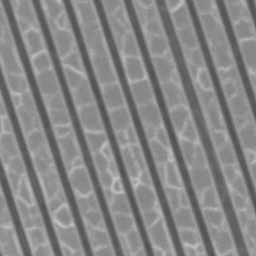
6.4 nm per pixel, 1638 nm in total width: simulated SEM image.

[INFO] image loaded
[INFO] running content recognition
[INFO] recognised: parallel lines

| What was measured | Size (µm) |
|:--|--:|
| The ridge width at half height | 0.134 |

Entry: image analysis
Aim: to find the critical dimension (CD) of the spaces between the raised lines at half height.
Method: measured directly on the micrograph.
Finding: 56.2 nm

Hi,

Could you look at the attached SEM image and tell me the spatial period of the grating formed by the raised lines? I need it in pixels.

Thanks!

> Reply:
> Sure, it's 29.1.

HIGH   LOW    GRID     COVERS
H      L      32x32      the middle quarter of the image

HHHHHLLHHHHHLLLHHHHHLLHHHHHHLLLH
HHHHHLLHHHHHHLLHHHHHHLLHHHHHLLLH
HHHHHHLLHHHHHLLHHHHHHLLHHHHHHLLL
LHHHHHLLHHHHHLLLHHHHHLLHHHHHHLLL
LHHHHHLLHHHHHHLLHHHHHHLLHHHHHLLL
LHHHHHHLLHHHHHLLHHHHHHLLHHHHHHLL
LLHHHHHLLHHHHHLLLHHHHHLLHHHHHHLL
LLHHHHHLLHHHHHHLLHHHHHHLLHHHHHLL
LLHHHHHHLLHHHHHLLHHHHHHLLHHHHHHL
LLHHHHHHLLHHHHHHLLHHHHHLLHHHHHHL
HLLHHHHHLLHHHHHHLLHHHHHHLLHHHHHL
HLLHHHHHHLLHHHHHLLHHHHHHLLHHHHHH
HLLHHHHHHLLHHHHHHLLHHHHHLLHHHHHH
HLLLHHHHHLLHHHHHHLLHHHHHHLLHHHHH
HHLLHHHHHHLLHHHHHLLHHHHHHLLHHHHH
HHLLHHHHHHLLHHHHHHLLHHHHHLLHHHHH
HHLLLHHHHHLLHHHHHHLLHHHHHHLLHHHH
HHHLLHHHHHHLLHHHHHLLHHHHHHLLHHHH
HHHLLHHHHHHLLHHHHHHLLHHHHHLLHHHH
HHHLLLHHHHHLLHHHHHHLLHHHHHHLLHHH
HHHHLLHHHHHHLLHHHHHLLHHHHHHLLHHH
HHHHLLHHHHHHLLHHHHHHLLHHHHHLLHHH
HHHHLLLHHHHHLLHHHHHHLLHHHHHHLLHH
HHHHHLLHHHHHHLLHHHHHLLHHHHHHLLHH
HHHHHLLHHHHHHLLHHHHHLLLHHHHHLLHH
HHHHHLLLHHHHHLLHHHHHHLLHHHHHHLLH
HHHHHHLLHHHHHHLLHHHHHLLHHHHHHLLH
LHHHHHLLHHHHHHLLHHHHHLLLHHHHHLLH
LHHHHHLLLHHHHHLLHHHHHHLLHHHHHHLL
LHHHHHHLLHHHHHHLHHHHHHLLHHHHHHLL
LLHHHHHLLHHHHHHLLHHHHHLLLHHHHHLL
LLHHHHHLLLHHHHHLLHHHHHHLLHHHHHLL